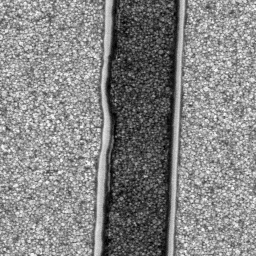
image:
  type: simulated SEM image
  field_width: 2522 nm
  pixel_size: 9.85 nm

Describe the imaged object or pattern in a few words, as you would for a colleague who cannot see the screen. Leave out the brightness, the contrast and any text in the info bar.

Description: one or a few lines or trenches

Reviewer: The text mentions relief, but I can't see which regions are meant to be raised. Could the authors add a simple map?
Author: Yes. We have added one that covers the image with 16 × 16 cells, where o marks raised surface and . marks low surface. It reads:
ooooooo....ooooo
ooooooo....ooooo
ooooooo....ooooo
ooooooo....ooooo
ooooooo....ooooo
oooooo.....ooooo
ooooooo....ooooo
ooooooo....ooooo
ooooooo....ooooo
oooooo.....ooooo
oooooo.....ooooo
oooooo.....ooooo
oooooo.....ooooo
oooooo.....ooooo
oooooo.....ooooo
oooooo.....ooooo